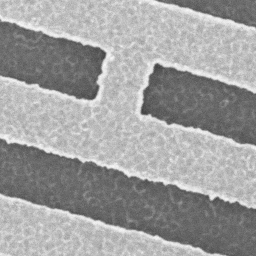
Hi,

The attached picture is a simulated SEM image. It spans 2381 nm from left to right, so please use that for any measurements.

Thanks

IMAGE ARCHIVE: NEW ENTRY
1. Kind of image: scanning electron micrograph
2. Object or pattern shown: one or a few lines or trenches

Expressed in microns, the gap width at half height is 0.52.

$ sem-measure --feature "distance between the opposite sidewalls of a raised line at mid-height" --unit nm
536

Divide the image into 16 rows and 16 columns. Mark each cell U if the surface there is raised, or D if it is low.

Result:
UUUUUUUUUUUDDDDD
DUUUUUUUUUUUUUUD
DDDDDUUUUUUUUUUU
DDDDDDDUUUUUUUUU
DDDDDDUUUDDDUUUU
UUUDDDUUUDDDDDDU
UUUUUUUUUDDDDDDD
UUUUUUUUUUDDDDDD
UUUUUUUUUUUUUDDD
DDDUUUUUUUUUUUUU
DDDDDDDUUUUUUUUU
DDDDDDDDDDDUUUUU
UDDDDDDDDDDDDDUU
UUUUUDDDDDDDDDDD
UUUUUUUUUDDDDDDD
UUUUUUUUUUUUDDDD